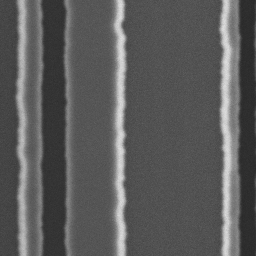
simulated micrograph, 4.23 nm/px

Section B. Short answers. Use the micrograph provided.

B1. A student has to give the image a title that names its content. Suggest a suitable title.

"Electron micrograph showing lines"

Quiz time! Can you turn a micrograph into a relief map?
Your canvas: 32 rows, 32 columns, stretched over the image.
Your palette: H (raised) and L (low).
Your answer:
LLLHHLLLHHHHHHHLLLLLLLLLLLLLHHLL
LLLHHLLLHHHHHHHLLLLLLLLLLLLLHHLL
LLLHHLLLHHHHHHHLLLLLLLLLLLLLHHLL
LLLHHLLLHHHHHHHLLLLLLLLLLLLLHHLL
LLLHHLLLHHHHHHHLLLLLLLLLLLLLHHLL
LLLHHLLLHHHHHHHLLLLLLLLLLLLLHHLL
LLLHHLLLHHHHHHHLLLLLLLLLLLLLHHLL
LLLHHLLLHHHHHHHLLLLLLLLLLLLLHHLL
LLLHHLLLHHHHHHHLLLLLLLLLLLLLHHLL
LLLHHLLLHHHHHHHLLLLLLLLLLLLLHHLL
LLHHHLLLHHHHHHHLLLLLLLLLLLLLHHLL
LLHHHLLLHHHHHHHLLLLLLLLLLLLLHHLL
LLHHHLLLHHHHHHHLLLLLLLLLLLLLHHLL
LLLHHLLLHHHHHHHLLLLLLLLLLLLLHHLL
LLLHHLLLHHHHHHHLLLLLLLLLLLLLHHLL
LLLHHLLLHHHHHHHLLLLLLLLLLLLLHHLL
LLLHHLLLHHHHHHHLLLLLLLLLLLLLHHLL
LLLHHLLLHHHHHHHLLLLLLLLLLLLLHHLL
LLLHHLLLHHHHHHHLLLLLLLLLLLLLHHLL
LLLHHLLLHHHHHHHLLLLLLLLLLLLLHHLL
LLLHHLLLHHHHHHHLLLLLLLLLLLLLHHLL
LLLHHLLLHHHHHHHLLLLLLLLLLLLLHHLL
LLLHHLLLHHHHHHHLLLLLLLLLLLLLHHLL
LLLHHLLLHHHHHHHLLLLLLLLLLLLLHHLL
LLLHHLLLHHHHHHHLLLLLLLLLLLLLHHLL
LLLHHLLLHHHHHHHLLLLLLLLLLLLLHHLL
LLLHHLLLHHHHHHHLLLLLLLLLLLLLHHLL
LLLHHLLLHHHHHHHLLLLLLLLLLLLLHHLL
LLLHHLLLHHHHHHHLLLLLLLLLLLLLHHLL
LLLHHLLLHHHHHHHLLLLLLLLLLLLLHHLL
LLLHHLLLHHHHHHHLLLLLLLLLLLLLHHLL
LLLHHLLLHHHHHHHLLLLLLLLLLLLLHHLL